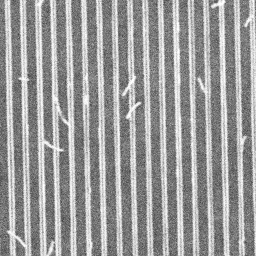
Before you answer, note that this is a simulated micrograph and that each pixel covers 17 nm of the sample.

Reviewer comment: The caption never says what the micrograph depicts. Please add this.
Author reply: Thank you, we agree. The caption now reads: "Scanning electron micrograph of parallel lines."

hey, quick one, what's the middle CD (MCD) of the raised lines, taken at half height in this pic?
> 61.7 nanometres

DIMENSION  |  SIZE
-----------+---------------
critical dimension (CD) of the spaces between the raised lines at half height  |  200 nm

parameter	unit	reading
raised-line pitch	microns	0.26